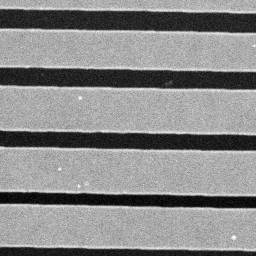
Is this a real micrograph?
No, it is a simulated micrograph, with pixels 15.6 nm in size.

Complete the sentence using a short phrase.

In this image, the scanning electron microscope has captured lines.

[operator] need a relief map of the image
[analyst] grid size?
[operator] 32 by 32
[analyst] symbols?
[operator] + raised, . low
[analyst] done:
++++++++++++++++++++++++++++++++
............................++++
................................
................................
++++++++++++++++++++++++++++++++
++++++++++++++++++++++++++++++++
++++++++++++++++++++++++++++++++
++++++++++++++++++++++++++++++++
..........++++++++++++++++++++++
................................
................................
++++++++++++++++++++++++++++++++
++++++++++++++++++++++++++++++++
++++++++++++++++++++++++++++++++
++++++++++++++++++++++++++++++++
++++++++++++++++++++++++++++++++
..........++++++++++++++++++++++
................................
++++++++........................
++++++++++++++++++++++++++++++++
++++++++++++++++++++++++++++++++
++++++++++++++++++++++++++++++++
++++++++++++++++++++++++++++++++
++++++++++++++++++++++++++++++++
................................
................................
++++++++++++++++++++++++++++++++
++++++++++++++++++++++++++++++++
++++++++++++++++++++++++++++++++
++++++++++++++++++++++++++++++++
++++++++++++++++++++++++++++++++
................................